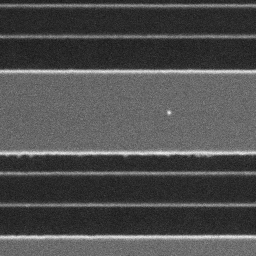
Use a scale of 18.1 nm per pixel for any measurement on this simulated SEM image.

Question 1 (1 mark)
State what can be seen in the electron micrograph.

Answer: lines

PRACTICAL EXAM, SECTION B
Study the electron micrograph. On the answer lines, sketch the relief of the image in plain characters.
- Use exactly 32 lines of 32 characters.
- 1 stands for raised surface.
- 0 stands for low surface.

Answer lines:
00000000000000000000000000000000
11111111111111111111111111111111
11111111111111111111111111111111
11111111111111111111111111111111
11111111111111111111111111111111
00000000000000000000000000000000
00000000000000000000000000000000
00000000000000000000000000000000
00000000000000000000000000000000
11111111111111111111111111111111
11111111111111111111111111111111
11111111111111111111111111111111
11111111111111111111111111111111
11111111111111111111111111111111
11111111111111111111111111111111
11111111111111111111111111111111
11111111111111111111111111111111
11111111111111111111111111111111
11111111111111111111111111111111
00000000000000000000000000000000
00000000000000000000000000000000
00000000000000000000000000000000
11111111111111111111111111111111
11111111111111111111111111111111
11111111111111111111111111111111
11111111111111111111111111111111
00000000000000000000000000000000
00000000000000000000000000000000
00000000000000000000000000000000
00000000000000000000000000000000
11111111111111111111111111111111
11111111111111111111111111111111